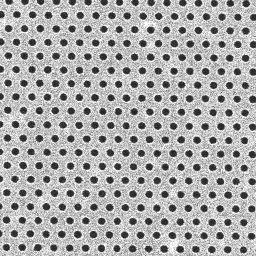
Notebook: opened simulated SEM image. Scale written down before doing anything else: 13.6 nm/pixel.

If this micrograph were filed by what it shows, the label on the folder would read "a regular array of holes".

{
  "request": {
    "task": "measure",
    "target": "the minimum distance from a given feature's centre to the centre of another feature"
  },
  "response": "208 nanometres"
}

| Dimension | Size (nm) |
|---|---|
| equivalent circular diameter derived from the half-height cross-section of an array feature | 104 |